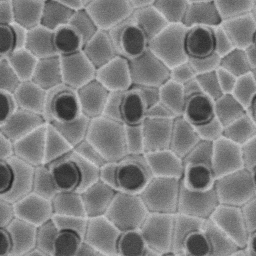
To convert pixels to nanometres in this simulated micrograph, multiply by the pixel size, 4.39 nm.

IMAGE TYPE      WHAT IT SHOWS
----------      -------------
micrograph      a regular array of raised bodies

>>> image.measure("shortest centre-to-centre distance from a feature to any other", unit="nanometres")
154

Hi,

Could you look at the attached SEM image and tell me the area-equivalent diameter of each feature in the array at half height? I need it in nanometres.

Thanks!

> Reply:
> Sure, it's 112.